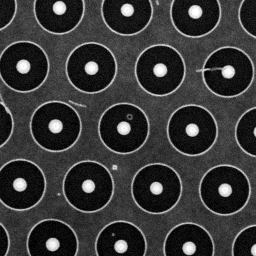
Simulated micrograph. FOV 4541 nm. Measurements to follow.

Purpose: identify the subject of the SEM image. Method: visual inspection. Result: an array of small figures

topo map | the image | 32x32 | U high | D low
DDUUDDDDDDUUUDDDDDDUUUDDDDDUUUDD
DDUUDDDDDDUUUDDDDDDUUDDDUDDDUUDD
DUUUUDDDDDUUUDDDDDDUUUDDDDDUUUDD
UUUUUUDDDUUUUUDDDDUUUUDDDDDUUUUD
UUUUUUUUUUUUUUUUUUUUUUUUDUUUUUUU
UUDDUUUUUUUDUUUUUUUUUUUUUUUUUUUU
UDDDDUUUUDDDDDUUUUDDDDUUUUUDDDUU
DDDDDDUUDDDDDDUUUDDDDDDUUUDDDDDU
DDDDDDUUDDDUDDDUUDDDDDDUUUDDDDDD
DDDDDDUUUDDDDDUUUDDDDDDUUDDDDDDD
UDDDDUUUUDDDDDUUUUDDDDUUUUDDDDDU
UUUUUUUUUUUDUUUUUUUDDUUUUUUDDDUU
UUUUUUUUUUUUUUUUUUUUUUUUUUUUUUUU
DUUUUDDDDUUUUUDDDUUUUUUDDUUUUUUU
DUUUDDDDDDUUUDDDDDUUUUDDDDUUUUDD
DDUUDDDDDDUUDDDDDDUUUDDDDDDUUUDD
DUUUDDDDDDUUDDDDDDDUUDDDDDDUUUDD
DUUUDDDDDDUUUDDDDDUUUDDDDDDUUUDD
UUUUUUDDDUUUUUDDDUUUUUDDDDUUUUDD
UUUUUUUUUUUUUUUUUUUUUUUUUUUUUUUU
UDDDUUUUUUDDUUUUUUUUUUUUUUUUUUUU
DDDDDUUUUDDDDDUUUDDDDDUUUUDDDDUU
DDDDDDUUDDDDDDUUUDDDDDUUUDDDDDDU
DDUDDDUUDDDDDDUUUDDUDDDUUDDDDDDU
DDDDDUUUDDDDDDUUUDDDDDUUUDDDDDDU
UDDDUUUUUDDDDUUUUDDDDDUUUUDDDDDU
UUUUUUUUUUUUUUUUUUUDDUUUUUUDDUUU
UUUUUUUUUUUUUUUUUUUUUUUUUUUUUUUU
UUUUDDDDDUUUUDDDDUUUUUDDDUUUUUUD
DUUUDDDDDUUUDDDDDDUUUDDDDDUUUUDD
DUUDDDUDDDUUDDDDDDUUUDDDDDDUUDDD
DUUUDDDDDDUUDDDDDDUUUDDDDDDUUDDD